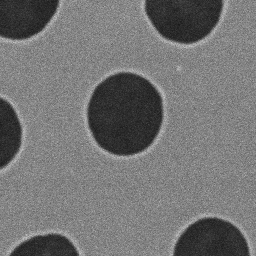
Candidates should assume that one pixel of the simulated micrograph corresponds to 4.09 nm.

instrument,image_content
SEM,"holes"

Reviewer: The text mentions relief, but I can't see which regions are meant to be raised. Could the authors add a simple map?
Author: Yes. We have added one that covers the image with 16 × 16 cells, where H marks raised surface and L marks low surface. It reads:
LLLLHHHHHLLLLLHH
LLLHHHHHHHLLLLHH
HHHHHHHHHHHLHHHH
HHHHHHHHHHHHHHHH
HHHHHHHHHHHHHHHH
HHHHHHLLLLHHHHHH
LHHHHHLLLLHHHHHH
LHHHHHLLLLHHHHHH
LHHHHHLLLLHHHHHH
LHHHHHHLLHHHHHHH
HHHHHHHHHHHHHHHH
HHHHHHHHHHHHHHHH
HHHHHHHHHHHHHHHH
HHHHHHHHHHHHHHHH
HHHHHHHHHHHLLLLH
HLLLLHHHHHHLLLLL